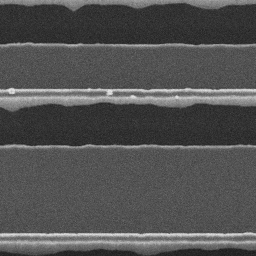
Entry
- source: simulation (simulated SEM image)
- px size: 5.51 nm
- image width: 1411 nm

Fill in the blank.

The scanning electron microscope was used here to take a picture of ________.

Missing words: lines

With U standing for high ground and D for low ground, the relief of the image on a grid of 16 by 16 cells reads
DDDDDDDDDDDDDDDD
DDDDDDDDDDDDDDDD
DDDDDDDDDDDDDDDD
UUUUUUUUUUUUUUUU
UUUUUUUUUUUUUUUU
UUUUUUUUUUUUUUUU
DDDDDDDDDDDDDDDD
DDDDDDDDDDDDDDDD
DDDDDDDDDDDDDDDD
UUUUUUUUUUUUUUUU
UUUUUUUUUUUUUUUU
UUUUUUUUUUUUUUUU
UUUUUUUUUUUUUUUU
UUUUUUUUUUUUUUUU
UUUUUUUUUUUUUUUU
DDDDDDDDDDDDDDDD